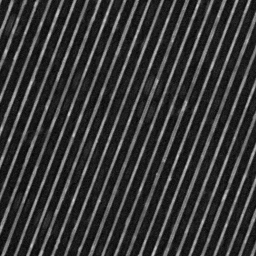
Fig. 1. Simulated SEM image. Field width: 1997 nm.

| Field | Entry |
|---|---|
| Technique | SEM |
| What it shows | parallel lines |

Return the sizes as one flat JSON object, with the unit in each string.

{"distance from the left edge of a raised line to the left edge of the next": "90.9 nm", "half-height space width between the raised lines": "68.3 nm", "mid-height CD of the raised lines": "19.2 nm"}